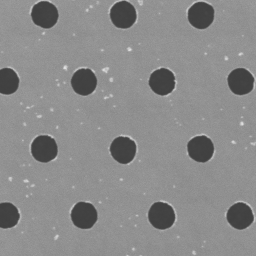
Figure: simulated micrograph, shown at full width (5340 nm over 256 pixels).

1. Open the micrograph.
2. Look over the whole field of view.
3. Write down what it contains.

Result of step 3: a regular array of holes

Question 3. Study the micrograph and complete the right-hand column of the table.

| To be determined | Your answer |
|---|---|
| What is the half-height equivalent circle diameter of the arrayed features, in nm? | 566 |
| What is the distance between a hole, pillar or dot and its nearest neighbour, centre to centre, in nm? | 1610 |